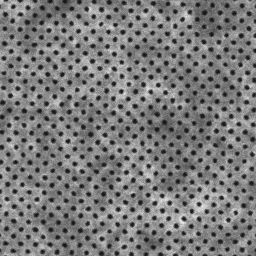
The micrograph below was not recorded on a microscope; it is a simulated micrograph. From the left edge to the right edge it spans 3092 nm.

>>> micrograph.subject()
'a regular array of holes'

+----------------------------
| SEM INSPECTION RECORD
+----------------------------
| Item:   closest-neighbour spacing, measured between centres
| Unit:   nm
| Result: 122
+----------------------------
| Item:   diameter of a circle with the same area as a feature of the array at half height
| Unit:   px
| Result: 5.29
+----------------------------